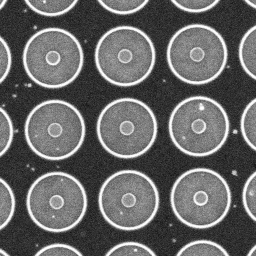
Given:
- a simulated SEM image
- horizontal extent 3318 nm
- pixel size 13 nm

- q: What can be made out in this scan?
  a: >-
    an array of small figures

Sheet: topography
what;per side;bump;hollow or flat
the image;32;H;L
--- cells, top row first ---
HHHHLLLLLHHHHLLLLLHHHHLLLLLHHHHL
HHHHHLLLHHHHHHHLHHHHHHHHHHHHHHHH
HHHHHHHHHHHHHHHHHHHHHHHHHHHHHHHH
HHHHHHHHHHHHHHHLHHHHHHHLLLHHHHHH
HHHHLLLLLHHHHLLLLLHHHHLLLLLHHHHL
LHHHLLLLLLHHLLLLLLLHHLLLLLLLHHLL
LHHLLLHLLLHHLLLHLLLHHLLLHLLLHHLL
LHHLLLHLLLHHLLLHLLLHHLLLHLLLHHLL
LHHLLLLLLLHHLLLLLLLHHHLLLLLLHHHL
LHHHLLLLLHHHHLLLLLHHHHLLLLLHHHHH
HHHHHLLLHHHHHHHLHHHHHHHHHHHHHHHH
HHHHHHHHHHHHHHHHHHHHHHHHHHHHHHHH
HHHHHHHHHHHHHHHHHHHHHHHHLLHHHHHH
HHHHHLLLLHHHHLLLLLHHHHLLLLLHHHHL
LHHHLLLLLLHHHLLLLLLHHHLLLLLLHHHL
LHHLLLLLLLHHLLLHLLLHHLLLHHLLHHLL
LHHLLLHHLLHHLLLHLLLHHLLLLLLLHHHL
LHHHLLLLLLHHHLLLLLLHHHLLLLLLHHHL
LHHHLLLLLLHHHLLLLLHHHHHLLLLHHHHH
HHHHHHLLHHHHHHHHHHHHHHHHHHHHHHHH
HHHHHHHHHHHHHHHHHHHHHHHHHHHHHHHH
HHHHHHHHHHHHHHHHHHHHHHHHLLHHHHHH
HHHHHLLLLHHHHHLLLLLHHHLLLLLLHHHL
LHHHLLLLLLHHHLLLLLLHHHLLLLLLHHHL
LHHHLLLLLLLHHLLLHLLLHHLLHHLLLHHL
LLHHLLHHLLLHHLLLHLLLHHLLLLLLLHHL
LHHHLLLLLLHHHLLLLLLHHHLLLLLLHHHL
LHHHLLLLLLHHHHLLLLLHHHHLLLLHHHHH
HHHHHHLLHHHHHHHHLHHHHHHHHHHHHHHH
HHHHHHHHHHHHHHHHHHHHHHHHHHHHHHHH
HHHHHHHHHHHHHHHHHHHHHHHHLLLHHHHH
HHHHHLLLLHHHHHLLLLLHHHHLLLLLHHHL